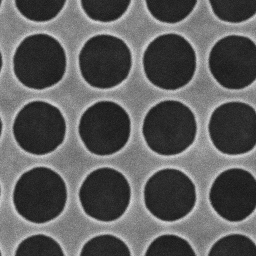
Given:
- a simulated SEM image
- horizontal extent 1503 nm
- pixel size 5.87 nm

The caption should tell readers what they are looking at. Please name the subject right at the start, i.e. a regular array of holes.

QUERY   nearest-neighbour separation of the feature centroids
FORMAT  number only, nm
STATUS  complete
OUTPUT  381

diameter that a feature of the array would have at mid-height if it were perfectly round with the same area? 0.321 µm